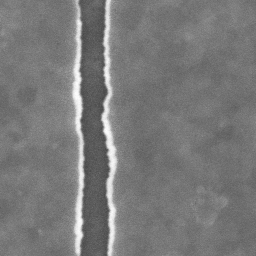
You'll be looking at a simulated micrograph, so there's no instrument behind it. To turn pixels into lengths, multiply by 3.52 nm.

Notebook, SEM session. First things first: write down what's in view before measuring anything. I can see one or a few lines or trenches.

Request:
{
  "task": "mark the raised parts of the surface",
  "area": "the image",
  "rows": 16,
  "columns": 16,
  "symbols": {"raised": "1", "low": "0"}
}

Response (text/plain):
1111100111111111
1111100111111111
1111100111111111
1111100111111111
1111100111111111
1111100111111111
1111100111111111
1111101111111111
1111100111111111
1111100111111111
1111100111111111
1111100111111111
1111100111111111
1111100111111111
1111100111111111
1111100111111111